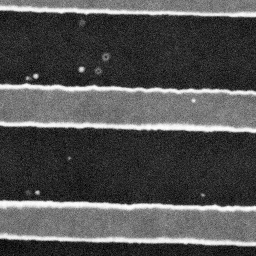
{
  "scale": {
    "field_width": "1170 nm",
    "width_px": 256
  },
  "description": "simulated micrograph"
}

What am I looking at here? lines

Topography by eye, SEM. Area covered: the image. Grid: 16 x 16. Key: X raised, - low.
XXXXXXXXXXXXXXXX
----------------
----------------
----------------
----------------
XXXXXXXX--------
XXXXXXXXXXXXXXXX
XXXXXXXXXXXXXXXX
----------------
----------------
----------------
----------------
----------------
XXXXXXXXXXXXXXXX
XXXXXXXXXXXXXXXX
----------------